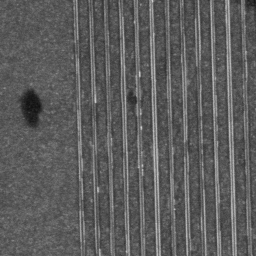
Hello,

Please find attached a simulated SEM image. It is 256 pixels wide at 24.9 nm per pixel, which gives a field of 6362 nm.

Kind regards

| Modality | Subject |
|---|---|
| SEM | parallel lines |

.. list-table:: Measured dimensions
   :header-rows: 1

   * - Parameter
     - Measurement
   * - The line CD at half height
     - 0.0745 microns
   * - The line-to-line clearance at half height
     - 0.298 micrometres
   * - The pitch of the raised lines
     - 377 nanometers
